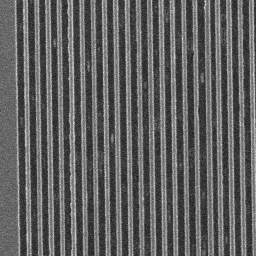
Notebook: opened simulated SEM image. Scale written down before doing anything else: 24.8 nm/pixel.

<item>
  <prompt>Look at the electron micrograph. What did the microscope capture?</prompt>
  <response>parallel lines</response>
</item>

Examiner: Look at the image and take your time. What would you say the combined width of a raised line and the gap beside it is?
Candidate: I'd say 0.279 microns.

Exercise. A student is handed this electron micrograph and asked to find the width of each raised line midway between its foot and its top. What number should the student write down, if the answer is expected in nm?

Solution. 99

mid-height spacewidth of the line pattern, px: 7